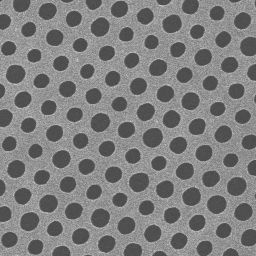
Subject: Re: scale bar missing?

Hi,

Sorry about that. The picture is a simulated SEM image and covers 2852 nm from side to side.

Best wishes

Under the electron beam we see a regular array of holes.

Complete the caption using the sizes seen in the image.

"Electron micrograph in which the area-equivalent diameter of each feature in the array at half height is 0.181 microns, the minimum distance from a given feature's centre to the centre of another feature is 292 nanometres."